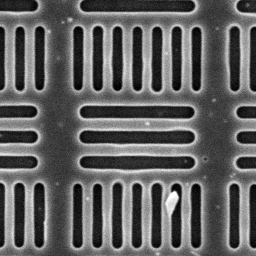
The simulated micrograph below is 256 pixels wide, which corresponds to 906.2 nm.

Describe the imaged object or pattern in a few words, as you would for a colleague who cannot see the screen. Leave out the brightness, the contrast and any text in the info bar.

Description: groups of lines, slits or small figures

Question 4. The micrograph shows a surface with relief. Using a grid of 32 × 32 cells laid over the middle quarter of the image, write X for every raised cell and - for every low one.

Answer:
XX---XX---XX---XX---XX---XX---XX
XX---XX---XX---XX---XX---XX---XX
XX---XX---XX---XX---XX---XX---XX
XX---XX---XX---XX---XX---XX---XX
XX---XX---XX---XX---XX---XX---XX
XX---XX---XX---XX---XX---XX--XXX
XXX-XXXX-XXXX-XXXX-XXX--XXXX-XXX
XXXXXXXXXXXXXXXXXXXXXXXXXXXXXXXX
XXXXXXXXXXXXXXXXXXXXXXXXXXXXXXXX
XXXXXXXXXXXXXXXXXXXXXXXXXXXXXXXX
XXXXX--------------------------X
XXXX----------------------------
XXXX----------------------------
XXXX----------------------------
XXXXXXXXXXXXXXXXXXXXXXXXXXXXXXXX
XXXXXXXXXXXXXXXXXXXXXXXXXXXXXXXX
XXXXX---------XXXXXXXXXXXX-----X
XXXX----------------------------
XXXX----------------------------
XXXX----------------------------
XXXXXXXXXXXXXXXXXXXXXXXXXXXXXXXX
XXXXXXXXXXXXXXXXXXXXXXXXXXXXXXXX
XXXXXXXXXXXXXXXXXXXXXXXXXXXXXXXX
XXXX----------------------------
XXXX----------------------------
XXXX----------------------------
XXXXXXXX---XX---------XXX------X
XXXXXXXXXXXXXXXXXXXXXXXXXXXXXXXX
XXXXXXXXXXXXXXXXXXXXXXXXXXXXXXXX
XXXXXXXXXXXXX-XXXXXXXXXXXXXXXXXX
XX--XXX--XXX---XX---XX---XX--XXX
XX---XX---XX---XX---XX---X----X-